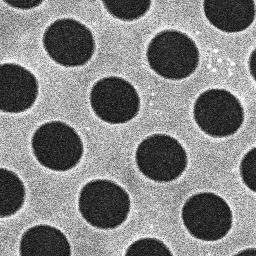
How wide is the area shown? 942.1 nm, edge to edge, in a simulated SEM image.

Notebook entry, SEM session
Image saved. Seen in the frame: a regular array of holes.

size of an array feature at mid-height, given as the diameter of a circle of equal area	180	nm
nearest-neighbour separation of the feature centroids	270	nm